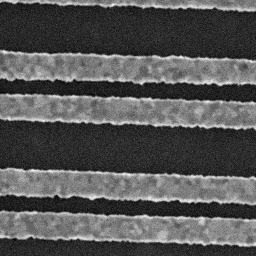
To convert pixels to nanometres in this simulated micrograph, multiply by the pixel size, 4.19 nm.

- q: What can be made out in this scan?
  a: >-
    lines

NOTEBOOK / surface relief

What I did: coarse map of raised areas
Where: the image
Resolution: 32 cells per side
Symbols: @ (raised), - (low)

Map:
-------@@@@@@@@@@@@@@@@@@@@@@@@@
--------------------------------
--------------------------------
--------------------------------
--------------------------------
--------------------------------
@-------------------------------
@@@@@@@@@@@@@@@@@@@@@@@@@@@@@@@-
@@@@@@@@@@@@@@@@@@@@@@@@@@@@@@@@
@@@@@@@@@@@@@@@@@@@@@@@@@@@@@@@@
------------------------@--@@-@@
--------------------------------
@@@@@@@@@@@@@@@@@@@@@@@---------
@@@@@@@@@@@@@@@@@@@@@@@@@@@@@@@@
@@@@@@@@@@@@@@@@@@@@@@@@@@@@@@@@
--------------@--@@@@@@@@@@@@@@@
--------------------------------
--------------------------------
--------------------------------
--------------------------------
--------------------------------
@@@@@@@@@@-@--------------------
@@@@@@@@@@@@@@@@@@@@@@@@@@@@@@@@
@@@@@@@@@@@@@@@@@@@@@@@@@@@@@@@@
---@@@@@@-@@@@@@@@@@@@@@@@@@@@@@
-------------------------------@
@@-@@---------------------------
@@@@@@@@@@@@@@@@@@@@@@@@@@@@@@@@
@@@@@@@@@@@@@@@@@@@@@@@@@@@@@@@@
@@@@@@@@@@@@@@@@@@@@@@@@@@@@@@@@
------------------------@@@@@@@@
--------------------------------